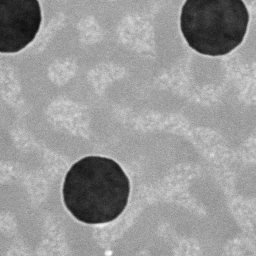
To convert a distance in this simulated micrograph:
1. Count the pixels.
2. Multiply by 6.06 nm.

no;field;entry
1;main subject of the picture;holes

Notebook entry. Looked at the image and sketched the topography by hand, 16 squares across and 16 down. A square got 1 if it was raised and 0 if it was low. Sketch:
0011111111100001
0011111111100001
0011111111110001
1111111111111011
1111111111111111
1111111111111111
1111111111111111
1111111111111111
1111111111111111
1111111111111111
1111000011111111
1111000011111111
1111000011111111
1111100111111111
1111111111111111
1111111111111111